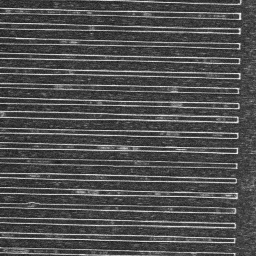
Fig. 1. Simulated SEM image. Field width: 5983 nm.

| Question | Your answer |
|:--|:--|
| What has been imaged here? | parallel lines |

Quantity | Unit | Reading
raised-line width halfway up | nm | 126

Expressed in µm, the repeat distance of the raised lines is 0.349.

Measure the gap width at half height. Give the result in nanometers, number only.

231